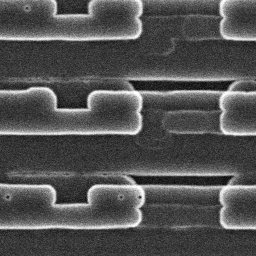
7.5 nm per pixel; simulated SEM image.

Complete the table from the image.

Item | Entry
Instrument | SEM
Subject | wiring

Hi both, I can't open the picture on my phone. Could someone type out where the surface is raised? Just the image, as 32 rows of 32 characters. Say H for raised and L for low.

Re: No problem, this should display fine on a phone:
HHHHHHHLLLLHHHHHHHLLLLLLLLLLHHHH
HHHHHHHLLLLHHHHHHHLLLLLLLLLLHHHH
HHHHHHHHHHHHHHHHHLLLLLLLLLLLHHHH
HHHHHHHHHHHHHHHHHHLLLLLLLLLLHHHH
HHHHHHHHHHHHHHHHHLLLLLLLLLLLHHHH
LLLLLLLLLLLLLLLLLLLLLLLLLLLLLLLL
LLLLLLLLLLLLLLLLLLLLLLLLLLLLLLLL
LLLLLLLLLLLLLLLLLLLLLLLLLLLLLLLL
LLLLLLLLLLLLLLLLLLLLLLLLLLLLLLLL
LLLLLLLLLLLLLLLLLLLLLLLLLLLLLLLL
LLLLLLLLLLLLLLLLLLLLLLLLLLLLLLLL
HHHHHHHLLLLLHHLLLLLLLLLLLLLLLLLL
HHHHHHHLLLLHHHHHHHLLLLLLLLLLHHHH
HHHHHHHLLLLHHHHHHHLLLLLLLLLLHHHH
HHHHHHHHHHHHHHHHHHLLLLLLLLLLHHHH
HHHHHHHHHHHHHHHHHHLLLLLLLLLLHHHH
HHHHHHHHHHHHHHHHHLLLLLLLLLLLHHHH
LLLLLLLLLLLLLLLLLLLLLLLLLLLLLLLL
LLLLLLLLLLLLLLLLLLLLLLLLLLLLLLLL
LLLLLLLLLLLLLLLLLLLLLLLLLLLLLLLL
LLLLLLLLLLLLLLLLLLLLLLLLLLLLLLLL
LLLLLLLLLLLLLLLLLLLLLLLLLLLLLLLL
LLLLLLLLLLLLLLLLLLLLLLLLLLLLLLLL
HHHHHHHLLLLLHHHHHLLLLLLLLLLLHHHH
HHHHHHHLLLLHHHHHHHLLLLLLLLLLHHHH
HHHHHHHLLLLHHHHHHHLLLLLLLLLLHHHH
HHHHHHHHHHHHHHHHHLLLLLLLLLLLHHHH
HHHHHHHHHHHHHHHHHHLLLLLLLLLLHHHH
HHHHHHLLLHHHHLLLLLLLLLLLLLLLHHHH
LLLLLLLLLLLLLLLLLLLLLLLLLLLLLLLL
LLLLLLLLLLLLLLLLLLLLLLLLLLLLLLLL
LLLLLLLLLLLLLLLLLLLLLLLLLLLLLLLL